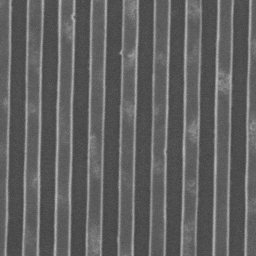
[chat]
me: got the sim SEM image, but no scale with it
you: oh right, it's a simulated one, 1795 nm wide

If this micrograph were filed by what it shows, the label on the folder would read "parallel lines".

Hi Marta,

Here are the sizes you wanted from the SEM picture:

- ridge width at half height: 102 nanometers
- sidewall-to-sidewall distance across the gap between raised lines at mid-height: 119 nanometres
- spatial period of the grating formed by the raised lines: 222 nm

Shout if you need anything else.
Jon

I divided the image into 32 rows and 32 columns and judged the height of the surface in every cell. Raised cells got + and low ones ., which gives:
+...+..++..++..++..++..++..++..+
+..++..++..++..++..++..++..++..+
+..++..++..++..++..++..++..++..+
+..++..++..++..++..++..++..++..+
+..++..++..++..++..++..++..++..+
+..++..++..++..++..++..++..++..+
+..++..++..++..++..++..++..++..+
+..++..++..++..++..++..++..++..+
+..++..++..++..++..++..++..++..+
+..++..++..++..++..++..++..++..+
+..++..++..++..++..++..++..++..+
+..++..++..++..++..++..++..++..+
+..++..++..++..++..++..++..++..+
+..++..++..++..++..++..++..++..+
+..++..++..++..++..++..++..++..+
+..++..++..++..++..++..++..++..+
+..++..++..++..++..++..++..++..+
+..++..++..++..++..++..++..++..+
+..++..++..++..++..++..++..++..+
+..++..++..++..++..++..++..++..+
+..++..++..++..++..++..++..++..+
+..++..++..++..++..++..++..++..+
+..++..++..++..++..++..++..++..+
+..++..++..++..++..++..++..++..+
+..++..++..++..++..++..++..++..+
+..++..++..++..++..++..++..++..+
+..++..++..++..++..++..++..++..+
+..++..++..++..++..++..++..++..+
+..++..++..++..++..++..+...++..+
+..++..++..++..++..++..+...++..+
+..++..++..++..++..++..+...++..+
+..++..++..++..++..++..+...+...+